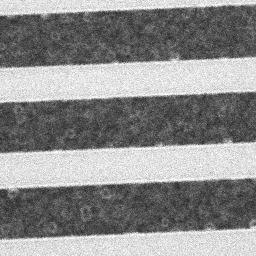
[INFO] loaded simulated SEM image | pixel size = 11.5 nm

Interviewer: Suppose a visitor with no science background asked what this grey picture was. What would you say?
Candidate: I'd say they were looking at one or a few lines or trenches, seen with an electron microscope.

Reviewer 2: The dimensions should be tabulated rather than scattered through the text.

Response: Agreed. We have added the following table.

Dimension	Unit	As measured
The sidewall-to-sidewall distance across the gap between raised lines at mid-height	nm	372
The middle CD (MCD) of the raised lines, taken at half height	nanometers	614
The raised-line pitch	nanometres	989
